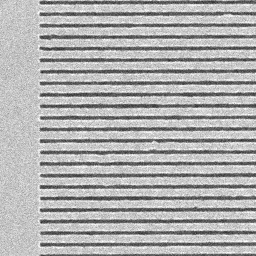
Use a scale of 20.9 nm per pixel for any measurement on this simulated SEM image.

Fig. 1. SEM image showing parallel lines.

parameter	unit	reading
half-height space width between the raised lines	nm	94.3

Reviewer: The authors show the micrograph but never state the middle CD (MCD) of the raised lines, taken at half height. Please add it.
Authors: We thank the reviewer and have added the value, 147 nm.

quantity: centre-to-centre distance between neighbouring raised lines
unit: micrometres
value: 0.241